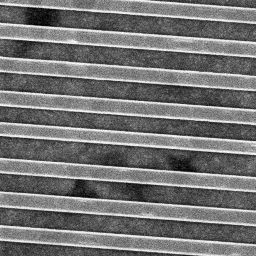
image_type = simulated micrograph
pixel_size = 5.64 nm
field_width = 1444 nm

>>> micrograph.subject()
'parallel lines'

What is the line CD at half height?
0.0787 um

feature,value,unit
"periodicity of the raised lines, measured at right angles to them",189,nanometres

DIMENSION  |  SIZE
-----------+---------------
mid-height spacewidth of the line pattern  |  109 nanometres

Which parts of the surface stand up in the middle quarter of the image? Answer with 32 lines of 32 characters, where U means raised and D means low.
UUUUUUUUUUUUUDDDDDDDDDDDDDDDDDDD
UUUUUUUUUUUUUUUUUUUUUUUUUUDDDDDD
UUUUUUUUUUUUUUUUUUUUUUUUUUUUUUUU
DDDDDDUUUUUUUUUUUUUUUUUUUUUUUUUU
DDDDDDDDDDDDDDDDDDDUUUUUUUUUUUUU
DDDDDDDDDDDDDDDDDDDDDDDDDDDDDDDD
DDDDDDDDDDDDDDDDDDDDDDDDDDDDDDDD
DDDDDDDDDDDDDDDDDDDDDDDDDDDDDDDD
UUUUUDDDDDDDDDDDDDDDDDDDDDDDDDDD
UUUUUUUUUUUUUUUUUUUDDDDDDDDDDDDD
UUUUUUUUUUUUUUUUUUUUUUUUUUUUUUUU
DUUUUUUUUUUUUUUUUUUUUUUUUUUUUUUU
DDDDDDDDDDDDDDUUUUUUUUUUUUUUUUUU
DDDDDDDDDDDDDDDDDDDDDDDDDDDDUUUU
DDDDDDDDDDDDDDDDDDDDDDDDDDDDDDDD
DDDDDDDDDDDDDDDDDDDDDDDDDDDDDDDD
UUUUUUDDDDDDDDDDDDDDDDDDDDDDDDDD
UUUUUUUUUUUUUUUUUUUUDDDDDDDDDDDD
UUUUUUUUUUUUUUUUUUUUUUUUUUUUUUUU
DDDDDDDDUUUUUUUUUUUUUUUUUUUUUUUU
DDDDDDDDDDDDDDDDDDDDDUUUUUUUUUUU
DDDDDDDDDDDDDDDDDDDDDDDDDDDDDDDD
DDDDDDDDDDDDDDDDDDDDDDDDDDDDDDDD
DDDDDDDDDDDDDDDDDDDDDDDDDDDDDDDD
DDDDDDDDDDDDDDDDDDDDDDDDDDDDDDDD
UUUUUUUUDDDDDDDDDDDDDDDDDDDDDDDD
UUUUUUUUUUUUUUUUUUUUDDDDDDDDDDDD
UUUUUUUUUUUUUUUUUUUUUUUUUUUUUUUU
DDUUUUUUUUUUUUUUUUUUUUUUUUUUUUUU
DDDDDDDDDDDDDDDDDUUUUUUUUUUUUUUU
DDDDDDDDDDDDDDDDDDDDDDDDDDDDDDDD
DDDDDDDDDDDDDDDDDDDDDDDDDDDDDDDD